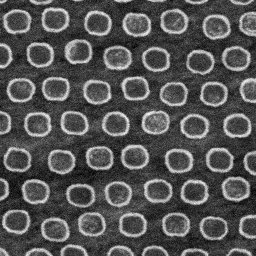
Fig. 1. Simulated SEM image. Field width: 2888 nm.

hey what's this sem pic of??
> a regular array of raised bodies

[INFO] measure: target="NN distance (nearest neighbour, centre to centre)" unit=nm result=402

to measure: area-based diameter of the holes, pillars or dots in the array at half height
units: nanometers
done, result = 279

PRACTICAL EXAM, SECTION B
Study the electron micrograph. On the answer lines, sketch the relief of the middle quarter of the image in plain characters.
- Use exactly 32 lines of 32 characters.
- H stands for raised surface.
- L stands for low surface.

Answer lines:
LLLLLLLLLLLHHHHHLLLLLHHHHHLLLLLH
LLLLLLLLLLLLLLLLLLLLLLHHLLLLLLLH
LLLLLLLLLLLLLLLLLLLLLLLLLLLLLLLL
LLLLLLLLLLLLLLLLLLHLLLLLLLLLLLLL
HLLLLLHHHLLLLLLHHHHHLLLLLLLLLLLL
HLLLLHHHHHHLLLLHHHHHHLLLLHHHHHLL
HLLLLHHHHHHLLLLHHHHHHLLLHHHHHHLL
HLLLLHHHHHHLLLLHHHHHHLLLHHHHHHHL
LLLLLLHHHHHLLLLLHHHHLLLLHHHHHHLL
LLLLLLLHHHLLLLLLLLLLLLLLLHHHHHLL
LLLLLLLLLLLLLLLLLLLLLLLLLLLLLLLL
LLLLLLLLLLLLLLLLLLLLLLLLLLLLLLLL
HHHHLLLLLLLHHHLLLLLLLHHHHLLLLLLL
HHHHHLLLLLHHHHHHLLLLHHHHHHLLLLLH
HHHHHHLLLLHHHHHHLLLLHHHHHHLLLHHH
HHHHHHLLLLHHHHHHLLLLHHHHHHLLLHHH
HHHHHHLLLLHHHHHHLLLLHHHHHHLLLHHH
LLLHHLLLLLLHHHHLLLLLLLLLLLLLLLHH
LLLLLLLLLLLLLLLLLLLLLLLLLLLLLLLL
LLLLLLLLLLLLLLLLLLLLLLLLLLLLLLLL
LLLLLLLLLLLLLLLLLLLLLLLLLLLLLLLL
LLLLLLHHHHHLLLLHHHHHLLLLLLLHLLLL
HHLLLLHHHHHHLLLHHHHHHLLLLLHHHHHL
HHLLLLHHHHHHLLLHHHHHHLLLLLHHHHHH
HHLLLLHHHHHHLLLHHHHHHLLLLLHHHHHH
HHLLLLLHHHHHLLLHHHHHLLLLLLHHHHHH
HHLLLLLLLLLLLLLLLLLLLLLLLLLHHHHL
LLLLLLLLLLLLLLLLLLLLLLLLLLLLLLLL
LLLLLLLLLLLLLLLLLLLLLLLLLLLLLLLL
LLLLLLLLLLLLLLLLLLLLLLHHHLLLLLLH
LLLHLLLLLLLHHHHHLLLLHHHHHHHLLLHH
LHHHHHHLLLLHHHHHHLLLLHHHHHHLLLHH